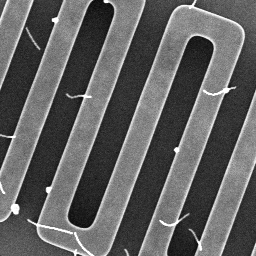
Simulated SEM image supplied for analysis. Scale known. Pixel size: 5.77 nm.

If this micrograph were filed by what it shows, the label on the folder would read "groups of lines, slits or small figures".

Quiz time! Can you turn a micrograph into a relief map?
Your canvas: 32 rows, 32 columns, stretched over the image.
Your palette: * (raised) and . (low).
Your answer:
.***....***...****..............
****...****...****....****......
***....***....***....********...
***....***....***....*********..
***...****...****...****.*****..
**....***....***....***....***..
**....***....***....***....***..
*....***....****...****...****..
*....***....***....***....***...
*...****...****....***....***...
....***....***....***....****...
....***....***....***....***....
...****...****...****...****....
...***....***....***....***....*
...***....***....***....***....*
..***....****...****...****...**
..***....***....***....***....**
.****...****....***....***....**
.***....***....****...****...***
.***....***....***....***....***
****...****...****...****....***
***....***....***....***....****
***....***....***....***....***.
***...****...****...****...****.
**....***....***....***....***..
**....***....***....***....***..
**...****...****...****...****..
*....****...***....***....***...
.....*****.****....***....***...
.....*********....***....****...
......********....***....***....
.........*****...****...****....